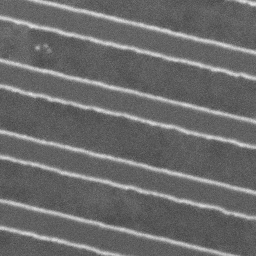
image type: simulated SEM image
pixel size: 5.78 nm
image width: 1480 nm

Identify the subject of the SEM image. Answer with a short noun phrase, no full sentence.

lines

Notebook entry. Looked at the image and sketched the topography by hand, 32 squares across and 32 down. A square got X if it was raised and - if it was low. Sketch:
XXXXXXX------------------------X
XXXXXXXXXXX---------------------
-XXXXXXXXXXXXXX-----------------
-----XXXXXXXXXXXXXXX------------
---------XXXXXXXXXXXXXXX--------
-------------XXXXXXXXXXXXXXX----
-----------------XXXXXXXXXXXXXXX
----------------------XXXXXXXXXX
XXXX----------------------XXXXXX
XXXXXXXX----------------------XX
XXXXXXXXXXXXX-------------------
--XXXXXXXXXXXXXXX---------------
------XXXXXXXXXXXXXXX-----------
----------XXXXXXXXXXXXXXX-------
----------------XXXXXXXXXXXXXX--
-------------------XXXXXXXXXXXXX
X----------------------XXXXXXXXX
XXXXX-----------------------XXXX
XXXXXXXXX-----------------------
XXXXXXXXXXXXX-------------------
---XXXXXXXXXXXXXX---------------
-------XXXXXXXXXXXXXXX----------
------------XXXXXXXXXXXXXX------
----------------XXXXXXXXXXXXXX--
--------------------XXXXXXXXXXXX
XXX---------------------XXXXXXXX
XXXXXXX---------------------XXXX
XXXXXXXXXX----------------------
XXXXXXXXXXXXXXX-----------------
----XXXXXXXXXXXXXXX-------------
--------XXXXXXXXXXXXXXX---------
------------XXXXXXXXXXXXXXX-----